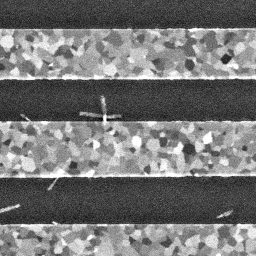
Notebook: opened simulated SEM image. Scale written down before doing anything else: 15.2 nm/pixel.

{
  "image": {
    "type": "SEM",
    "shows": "lines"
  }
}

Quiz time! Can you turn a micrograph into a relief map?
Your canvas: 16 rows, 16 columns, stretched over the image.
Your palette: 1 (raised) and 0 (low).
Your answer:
0000000000000000
0000000000000000
1111111111111111
1111111111111111
1111111111111111
0000000000000000
0000000000000000
0000000000000000
1111111111111111
1111111111111111
1111111111111111
0000000000000000
0000000000000000
0000000000000000
1111111111111111
1111111111111111